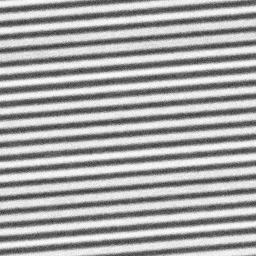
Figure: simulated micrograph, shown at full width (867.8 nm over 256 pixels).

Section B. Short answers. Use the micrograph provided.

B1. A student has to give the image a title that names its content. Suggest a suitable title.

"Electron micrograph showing parallel lines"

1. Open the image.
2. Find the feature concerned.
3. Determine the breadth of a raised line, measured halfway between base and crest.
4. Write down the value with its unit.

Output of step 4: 19 nm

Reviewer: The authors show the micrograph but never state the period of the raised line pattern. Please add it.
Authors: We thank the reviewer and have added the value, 0.0454 um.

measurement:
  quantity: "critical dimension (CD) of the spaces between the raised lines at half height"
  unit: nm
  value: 25.3